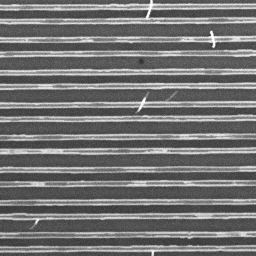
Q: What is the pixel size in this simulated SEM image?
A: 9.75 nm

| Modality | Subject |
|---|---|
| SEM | parallel lines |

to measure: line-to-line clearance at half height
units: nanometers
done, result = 95.1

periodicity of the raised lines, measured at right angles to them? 16.1 pixels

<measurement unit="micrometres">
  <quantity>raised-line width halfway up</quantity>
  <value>0.0524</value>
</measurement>